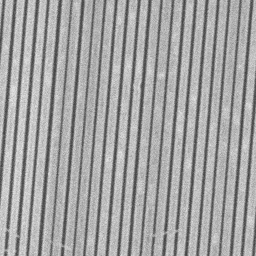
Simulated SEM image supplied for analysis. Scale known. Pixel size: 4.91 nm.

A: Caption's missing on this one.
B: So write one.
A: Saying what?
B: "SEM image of parallel lines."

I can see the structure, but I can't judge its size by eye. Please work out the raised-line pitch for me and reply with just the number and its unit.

11.2 pixels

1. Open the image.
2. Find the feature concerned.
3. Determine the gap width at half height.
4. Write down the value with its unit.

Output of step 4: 16.5 nm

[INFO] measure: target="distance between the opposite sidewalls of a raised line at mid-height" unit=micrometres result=0.0416